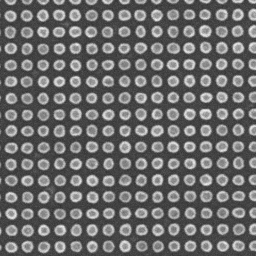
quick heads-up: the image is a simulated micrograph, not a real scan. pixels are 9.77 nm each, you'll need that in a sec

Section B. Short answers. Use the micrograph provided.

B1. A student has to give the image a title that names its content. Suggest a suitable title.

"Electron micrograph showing a regular array of raised bodies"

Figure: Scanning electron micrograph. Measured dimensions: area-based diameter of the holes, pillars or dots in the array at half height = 100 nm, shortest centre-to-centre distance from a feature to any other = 156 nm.